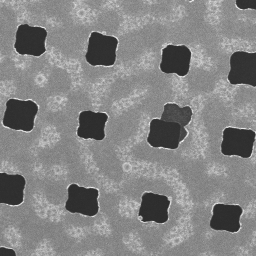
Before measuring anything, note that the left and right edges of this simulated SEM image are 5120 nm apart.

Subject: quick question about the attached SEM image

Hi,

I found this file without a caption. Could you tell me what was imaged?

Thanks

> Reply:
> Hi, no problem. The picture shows a regular array of holes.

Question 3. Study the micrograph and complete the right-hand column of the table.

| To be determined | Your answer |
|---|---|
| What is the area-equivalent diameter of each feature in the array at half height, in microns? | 0.649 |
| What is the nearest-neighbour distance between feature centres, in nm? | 1450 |